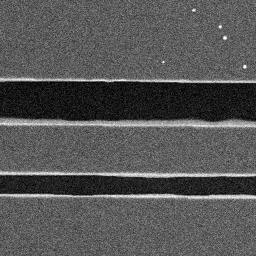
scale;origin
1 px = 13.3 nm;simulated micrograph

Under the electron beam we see lines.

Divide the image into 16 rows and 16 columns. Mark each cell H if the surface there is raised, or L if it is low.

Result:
HHHHHHHHHHHHHHHH
HHHHHHHHHHHHHHHH
HHHHHHHHHHHHHHHH
HHHHHHHHHHHHHHHH
HHHHHHHHHHHHHHHH
LLLLLLLLLLLLLLLL
LLLLLLLLLLLLLLLL
LLLLLLLLLLLLLLLL
HHHHHHHHHHHHHHHH
HHHHHHHHHHHHHHHH
HHHHHHHHHHHHHHHH
HHHHHHHHHHHHHHHH
HHHHHHHHHHHHHHHH
HHHHHHHHHHHHHHHH
HHHHHHHHHHHHHHHH
HHHHHHHHHHHHHHHH